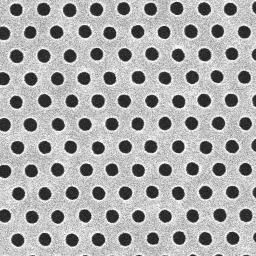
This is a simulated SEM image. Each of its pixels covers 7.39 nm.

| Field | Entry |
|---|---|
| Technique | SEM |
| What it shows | a regular array of holes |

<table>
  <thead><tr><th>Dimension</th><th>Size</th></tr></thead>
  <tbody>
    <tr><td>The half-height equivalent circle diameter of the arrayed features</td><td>0.1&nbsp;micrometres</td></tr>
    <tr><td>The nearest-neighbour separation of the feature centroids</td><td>0.19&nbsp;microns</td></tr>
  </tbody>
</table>